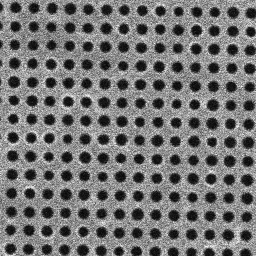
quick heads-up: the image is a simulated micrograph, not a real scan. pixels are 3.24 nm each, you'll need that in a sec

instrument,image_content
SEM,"a regular array of holes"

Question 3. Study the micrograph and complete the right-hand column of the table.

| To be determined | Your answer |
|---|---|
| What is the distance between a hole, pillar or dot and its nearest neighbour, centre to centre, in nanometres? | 57.8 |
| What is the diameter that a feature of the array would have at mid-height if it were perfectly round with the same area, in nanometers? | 36.9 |